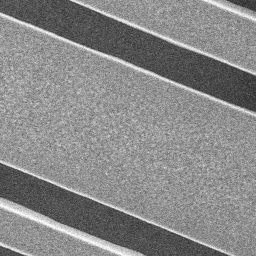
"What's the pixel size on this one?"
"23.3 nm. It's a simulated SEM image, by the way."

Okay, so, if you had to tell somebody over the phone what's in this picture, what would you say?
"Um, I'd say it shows lines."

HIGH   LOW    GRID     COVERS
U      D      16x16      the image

DDDDDDUUUUUUUUUD
UUDDDDDDUUUUUUUU
UUUUDDDDDDDUUUUU
UUUUUUUDDDDDDUUU
UUUUUUUUUDDDDDDD
UUUUUUUUUUUUDDDD
UUUUUUUUUUUUUUDD
UUUUUUUUUUUUUUUU
UUUUUUUUUUUUUUUU
UUUUUUUUUUUUUUUU
DUUUUUUUUUUUUUUU
DDDUUUUUUUUUUUUU
DDDDDDUUUUUUUUUU
UUDDDDDDUUUUUUUU
UUUUUDDDDDDUUUUU
DUUUUUUDDDDDDUUU